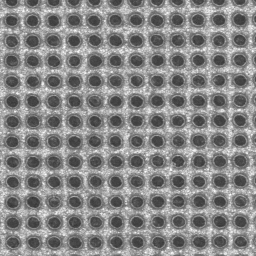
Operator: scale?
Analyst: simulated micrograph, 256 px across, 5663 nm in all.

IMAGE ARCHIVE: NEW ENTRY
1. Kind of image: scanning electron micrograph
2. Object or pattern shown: a regular array of raised bodies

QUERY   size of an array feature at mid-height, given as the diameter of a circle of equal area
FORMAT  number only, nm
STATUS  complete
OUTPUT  282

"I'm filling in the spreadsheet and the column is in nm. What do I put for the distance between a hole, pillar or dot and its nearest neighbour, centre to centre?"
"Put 443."